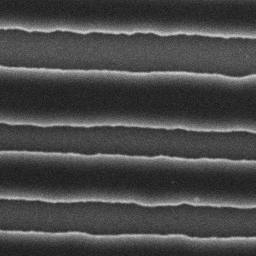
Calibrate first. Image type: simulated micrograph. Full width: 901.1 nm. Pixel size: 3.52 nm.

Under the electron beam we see lines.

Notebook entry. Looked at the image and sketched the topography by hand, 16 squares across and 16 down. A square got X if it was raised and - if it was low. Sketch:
XXXXXXXXXXXXXXXX
XXXXXXXXXXXXXXXX
----------------
----------------
XXXXXXXX--------
XXXXXXXXXXXXXXXX
XXXXXXXXXXXXXXXX
XXXXXXXXXXXXXXXX
----------------
XX--------------
XXXXXXXXXXXXXXXX
XXXXXXXXXXXXXXXX
--XXXXXXXXXXXXXX
----------------
XX--------------
XXXXXXXXXXXXXXXX